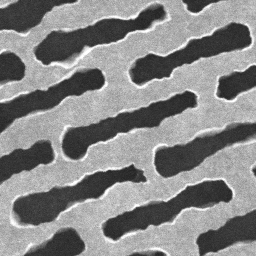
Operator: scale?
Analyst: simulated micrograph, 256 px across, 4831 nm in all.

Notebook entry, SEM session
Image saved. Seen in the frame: holes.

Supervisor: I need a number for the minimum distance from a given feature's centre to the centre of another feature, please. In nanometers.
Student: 1760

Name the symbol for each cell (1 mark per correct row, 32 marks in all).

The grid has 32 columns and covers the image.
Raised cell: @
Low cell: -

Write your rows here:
@-------@@@@@@@@@@@@@@@---@@@@@@
------@@@@@@@@@@@@---@@@-@@@@@@@
-----@@@@@@@@------@@@@@@@@@@@@@
----@@@@@@--------@@@@@@@@@@---@
@@@@@@----------@@@@@@@@@@-----@
@@@@@--------@@@@@@@@@@--------@
--@@------@@@@@@@@@@@@------@@@@
---@@----@@@@@@@@--------@@@@@@@
---@@@@@@@@@@@@@------@@@@@@@@@-
---@@@@@@----@@@-----@@@@@@@----
@@@@@@@------@@@@-@@@@@@@@@-----
@@@@-------@@@@@@@@@@@@-@@@---@@
@-------@@@@@@@@@@@@@----@@@@@@@
-------@@@@@@@@@@@------@@@@@@@@
---@@@@@@@@@@@--------@@@@@@@@@@
-@@@@@@@@@@---------@@@@@@@@@---
@@@@@@@@--------@@@@@@@@@@@@----
@@@@@@@@------@@@@@@@@@@-------@
@@@----@---@@@@@@@@@--------@@@@
-------@--@@@@@@@@@-------@@@@@@
------@@@@@@@@@@@@@------@@@@@@@
---@@@@@@@@@------@@---@@@@@@@@@
-@@@@@@@@@--------@@@@@@@@@-@@@@
@@@@@@--------@@@@@@@@@------@@@
@@@----------@@@@@@@@@-------@@@
@@-------@@@@@@@@@---------@@@@@
@@------@@@@@@@@-------@@@@@@@@-
@@-----@@@@@@---------@@@@@@----
@@@@@@@@-@@@@-----@@@@@@@@@-----
@@@@@@@---@@@--@@@@@@@@@@-------
@@@@@------@@@@@@@@@@@@@@----@@@
@@@-------@@@@@@@@--@@@@@--@@@@@